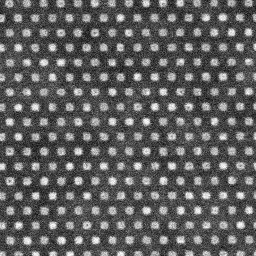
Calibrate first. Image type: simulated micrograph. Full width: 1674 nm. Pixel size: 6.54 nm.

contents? a regular array of raised bodies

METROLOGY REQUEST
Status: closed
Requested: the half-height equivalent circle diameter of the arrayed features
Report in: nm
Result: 47.8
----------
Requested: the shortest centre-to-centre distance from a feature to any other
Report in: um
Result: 0.11